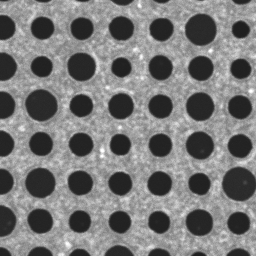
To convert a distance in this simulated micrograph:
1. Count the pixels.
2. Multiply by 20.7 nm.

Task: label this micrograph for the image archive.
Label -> a regular array of holes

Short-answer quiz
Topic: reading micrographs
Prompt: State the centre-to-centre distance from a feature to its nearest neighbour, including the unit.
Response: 38.5 pixels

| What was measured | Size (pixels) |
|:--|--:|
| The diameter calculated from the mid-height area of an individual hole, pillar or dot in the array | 24.6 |